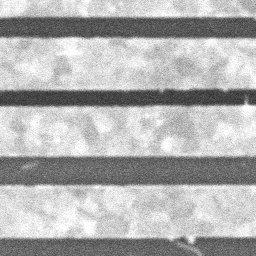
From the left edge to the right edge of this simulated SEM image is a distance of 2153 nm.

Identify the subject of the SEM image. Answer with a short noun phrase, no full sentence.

lines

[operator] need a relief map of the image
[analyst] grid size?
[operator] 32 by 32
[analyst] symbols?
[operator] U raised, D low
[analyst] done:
UUUUUUUUUUUUUUUUUUUUUUUUUUUUUUUU
UUUUUUUUUUUUUUUUUUUUUUUUUUUUUUUU
DDDDDDDDDDDDDDDDDDDDDDDDDDDDDDDD
DDDDDDDDDDDDDDDDDDDDDDDDDDDDDDDD
DDDDDDDDDDDDDDDDDDDDDDDDDDDDDDDD
UUUUUUUUUUUUUUUUUUUUUUUUUUUUUUUU
UUUUUUUUUUUUUUUUUUUUUUUUUUUUUUUU
UUUUUUUUUUUUUUUUUUUUUUUUUUUUUUUU
UUUUUUUUUUUUUUUUUUUUUUUUUUUUUUUU
UUUUUUUUUUUUUUUUUUUUUUUUUUUUUUUU
UUUUUUUUUUUUUUUUUUUUUUUUUUUUUUUU
DDDDDDDDDDDDDDDDDDDDDDDDDDDDDDDD
DDDDDDDDDDDDDDDDDDDDDDDDDDDDDDDD
UUUUUUUUUUUUUUUUUUUUUUUUUUUUUUUU
UUUUUUUUUUUUUUUUUUUUUUUUUUUUUUUU
UUUUUUUUUUUUUUUUUUUUUUUUUUUUUUUU
UUUUUUUUUUUUUUUUUUUUUUUUUUUUUUUU
UUUUUUUUUUUUUUUUUUUUUUUUUUUUUUUU
UUUUUUUUUUUUUUUUUUUUUUUUUUUUUUUU
DDDDDDDDDDDDDDDDDDDDDDDDDDDDDDDD
DDDDDDDDDDDDDDDDDDDDDDDDDDDDDDDD
DDDDDDDDDDDDDDDDDDDDDDDDDDDDDDDD
DDDDDDDDDDDDDDDDDDDDDDDDDDDDDDDD
UUUUUUUUUUUUUUUUUUUUUUUUUUUUUUUU
UUUUUUUUUUUUUUUUUUUUUUUUUUUUUUUU
UUUUUUUUUUUUUUUUUUUUUUUUUUUUUUUU
UUUUUUUUUUUUUUUUUUUUUUUUUUUUUUUU
UUUUUUUUUUUUUUUUUUUUUUUUUUUUUUUU
UUUUUUUUUUUUUUUUUUUUUUUUUUUUUUUU
UUUUUUUUUUUUUUUUUUUUUUUUUUUUUUUU
DDDDDDDDDDDDDDDDDDDDDDDDDDDDDDDD
DDDDDDDDDDDDDDDDDDDDDDDDDDDDDDDD